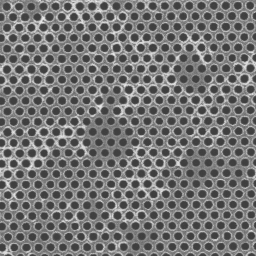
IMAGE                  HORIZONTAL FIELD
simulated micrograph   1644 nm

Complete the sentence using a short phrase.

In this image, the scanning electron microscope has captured a regular array of holes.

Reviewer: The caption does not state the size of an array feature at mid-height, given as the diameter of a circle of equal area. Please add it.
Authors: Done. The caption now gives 48 nm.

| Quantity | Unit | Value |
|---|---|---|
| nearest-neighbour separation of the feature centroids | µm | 0.0759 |